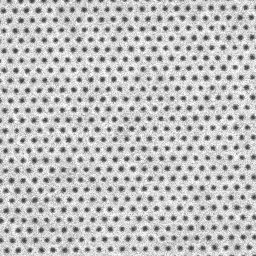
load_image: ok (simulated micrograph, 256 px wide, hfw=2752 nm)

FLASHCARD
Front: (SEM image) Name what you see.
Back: a regular array of holes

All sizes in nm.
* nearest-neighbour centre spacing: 121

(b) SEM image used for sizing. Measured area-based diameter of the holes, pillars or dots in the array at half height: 59.4 nm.